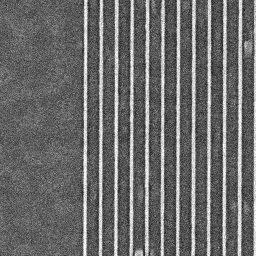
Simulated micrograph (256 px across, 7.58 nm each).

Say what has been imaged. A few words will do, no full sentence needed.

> parallel lines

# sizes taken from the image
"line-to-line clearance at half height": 12.9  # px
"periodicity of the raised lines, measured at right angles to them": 117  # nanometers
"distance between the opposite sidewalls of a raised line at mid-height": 21.8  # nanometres